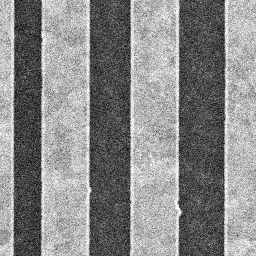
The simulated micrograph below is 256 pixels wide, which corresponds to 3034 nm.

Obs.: one or a few lines or trenches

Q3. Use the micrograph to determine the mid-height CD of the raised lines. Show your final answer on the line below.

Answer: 529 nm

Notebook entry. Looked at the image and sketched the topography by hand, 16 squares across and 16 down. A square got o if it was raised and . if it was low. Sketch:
o..oo...ooo...oo
o..oo...ooo...oo
o..oo...ooo...oo
o..oo...ooo...oo
o..oo...ooo...oo
o..oo...ooo...oo
o..oo...ooo...oo
o..oo...ooo...oo
o..oo...ooo...oo
o..oo...ooo...oo
o..oo...ooo...oo
o..ooo..ooo...oo
o..ooo..ooo...oo
o..oo...ooo...oo
o..oo...ooo...oo
o..oo...ooo...oo